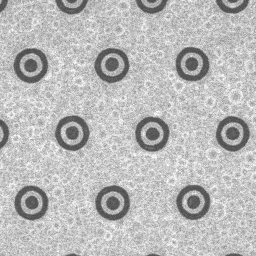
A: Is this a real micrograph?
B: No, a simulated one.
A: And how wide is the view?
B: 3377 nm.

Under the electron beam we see a regular array of ring-shaped grooves with a dot in the middle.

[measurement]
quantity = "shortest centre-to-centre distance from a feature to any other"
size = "1040 nm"